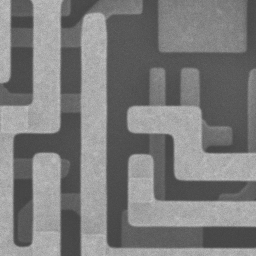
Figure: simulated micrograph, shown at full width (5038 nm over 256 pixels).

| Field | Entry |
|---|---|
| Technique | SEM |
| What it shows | wiring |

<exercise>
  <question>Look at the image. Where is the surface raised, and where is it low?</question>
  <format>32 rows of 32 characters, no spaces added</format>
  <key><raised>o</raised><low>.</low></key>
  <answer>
o...oooo........................
o...oooo........................
o...oooo..ooo...................
o...oooo..ooo...................
o...oooo..ooo...................
o...oooo..ooo...................
o...ooo...ooo...................
o...ooo...ooo...................
o...ooo...ooo...................
o...ooo...ooo...................
....ooo...ooo...................
....ooo...ooo...................
....ooo...ooo...................
ooooooo...ooo...ooooooooo.......
ooooooo...ooo...ooooooooo.......
ooooooo...ooo...ooooooooo.......
ooooooo...ooo....oooooooo.......
oo........ooo.........ooo.......
oo........ooo.........ooo.......
oo..ooo...ooo....oo...oooooooooo
oo..oooo..ooo...ooo...oooooooooo
oo..oooo..ooo...ooo...oooooooooo
oo..ooo...ooo...ooo....ooooooooo
oo..ooo...ooo...ooo.............
oo..ooo...ooo...ooo.............
oo..ooo...ooo...oooooooooooooooo
oo..ooo...ooo...oooooooooooooooo
oo..ooo...ooo...oooooooooooooooo
oo..ooo...ooo...................
oo..oooo..ooo...................
oo..oooo..ooo...................
ooooooo...oooooooooooooooooooooo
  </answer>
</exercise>